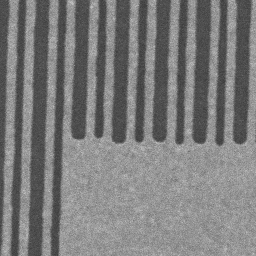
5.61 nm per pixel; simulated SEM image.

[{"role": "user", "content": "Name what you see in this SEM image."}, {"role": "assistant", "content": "parallel lines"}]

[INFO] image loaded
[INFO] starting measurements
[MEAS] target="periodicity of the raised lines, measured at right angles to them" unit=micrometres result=0.113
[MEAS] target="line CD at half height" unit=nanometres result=44.2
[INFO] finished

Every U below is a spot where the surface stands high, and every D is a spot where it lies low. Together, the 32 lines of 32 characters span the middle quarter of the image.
UUDDDDUUDDDUDDDDUUDDDUDDDDUUDDDU
UUDDDDUUDDDUDDDDUUDDDUDDDDUUDDDU
UUDDDDUUDDDUDDDDUUDDUUDDDDUUDDDU
UUDDDDUUDDUUDDDDUUDDUUDDDDUUDDDU
UUDDDDUUDDUUDDDDUUDDUUDDDDUUDDDU
UUDDDDUUDDUUDDDDUUDDUUDDDDUUDDUU
UUDDDDUUDDUUDDDDUUDDUUDDDDUUDDUU
UUDDDDUUDDUUDDDDUUDDUUDDDDUUDDUU
UUDDDDUUDDUUDDDDUUDDUUDDDDUUDDUU
UUDDDDUUDDUUDDDDUUDDUUDDDDUUDDUU
UUDDDDUUDDUUDDDDUUDDUUDDDDUUDDUU
UUDDDDUUDDUUDDDDUUDDUUDDDDUUDDUU
UUDDDDUDDDUUDDDDUUDDUUDDDDUUDDUU
UUDDDDUDDDUUDDDDUUDDUUDDDDUUDDUU
UUDDDDUDDDUUDDDDUDDDUUDDDDUUDDUU
UUDDDDUDDDUUDDDDUDDDUUDDDDUUDDUU
UUDDDDUDDDUUDDDDUDDDUUDDDDUUDDUU
UUDDDDUDDDUUDDDDUUDDUUDDDDUUDDUU
UUDDDUUUDDUUDDDDUUDDUUDDDDUUDDUU
UUUUUUUUUUUUDDDUUUDDUUUDDUUUDDUU
UUUUUUUUUUUUUUUUUUUUUUUUUUUUUUUU
UUUUUUUUUUUUUUUUUUUUUUUUUUUUUUUU
UUUUUUUUUUUUUUUUUUUUUUUUUUUUUUUU
UUUUUUUUUUUUUUUUUUUUUUUUUUUUUUUU
UUUUUUUUUUUUUUUUUUUUUUUUUUUUUUUU
UUUUUUUUUUUUUUUUUUUUUUUUUUUUUUUU
UUUUUUUUUUUUUUUUUUUUUUUUUUUUUUUU
UUUUUUUUUUUUUUUUUUUUUUUUUUUUUUUU
UUUUUUUUUUUUUUUUUUUUUUUUUUUUUUUU
UUUUUUUUUUUUUUUUUUUUUUUUUUUUUUUU
UUUUUUUUUUUUUUUUUUUUUUUUUUUUUUUU
UUUUUUUUUUUUUUUUUUUUUUUUUUUUUUUU